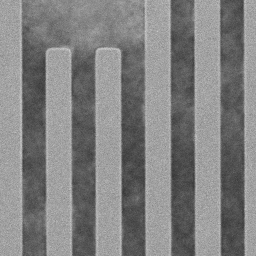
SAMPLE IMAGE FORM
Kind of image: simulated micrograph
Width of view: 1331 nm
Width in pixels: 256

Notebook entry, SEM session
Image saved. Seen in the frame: groups of lines, slits or small figures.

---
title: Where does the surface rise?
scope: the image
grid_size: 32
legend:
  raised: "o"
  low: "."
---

ooo...............ooo...ooo....o
ooo...............ooo...ooo....o
ooo...............ooo...ooo....o
ooo...............ooo...ooo....o
ooo...............ooo...ooo....o
ooo...............ooo...ooo....o
ooo...ooo...ooo...ooo...ooo....o
ooo...ooo...ooo...ooo...ooo....o
ooo...ooo...ooo...ooo...ooo....o
ooo...ooo...ooo...ooo...ooo....o
ooo...ooo...ooo...ooo...ooo....o
ooo...ooo...ooo...ooo...ooo....o
ooo...ooo...ooo...ooo...ooo....o
ooo...ooo...ooo...ooo...ooo....o
ooo...ooo...ooo...ooo...ooo....o
ooo...ooo...ooo...ooo...ooo....o
ooo...ooo...ooo...ooo...ooo....o
ooo...ooo...ooo...ooo...ooo....o
ooo...ooo...ooo...ooo...ooo....o
ooo...ooo...ooo...ooo...ooo....o
ooo...ooo...ooo...ooo...ooo....o
ooo...ooo...ooo...ooo...ooo....o
ooo...ooo...ooo...ooo...ooo....o
ooo...ooo...ooo...ooo...ooo....o
ooo...ooo...ooo...ooo...ooo....o
ooo...ooo...ooo...ooo...ooo....o
ooo...ooo...ooo...ooo...ooo....o
ooo...ooo...ooo...ooo...ooo....o
ooo...ooo...ooo...ooo...ooo....o
ooo...ooo...ooo...ooo...oooo...o
ooo...ooo...ooo...ooo...oooo...o
ooo...ooo...ooo...ooo...oooo...o